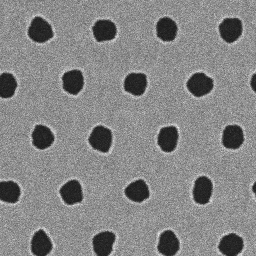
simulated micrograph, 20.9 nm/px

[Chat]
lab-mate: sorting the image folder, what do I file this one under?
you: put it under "a regular array of holes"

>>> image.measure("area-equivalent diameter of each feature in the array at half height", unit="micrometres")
0.513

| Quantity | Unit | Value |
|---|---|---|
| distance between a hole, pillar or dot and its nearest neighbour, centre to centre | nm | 1270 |